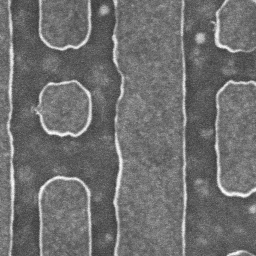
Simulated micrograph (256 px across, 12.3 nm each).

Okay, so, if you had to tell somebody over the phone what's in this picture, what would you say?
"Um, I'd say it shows one or a few lines or trenches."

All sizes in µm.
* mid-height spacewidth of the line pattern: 0.376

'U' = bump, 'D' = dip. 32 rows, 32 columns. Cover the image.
UDDDDUUUUUUDDDUUUUUUUUUDDDDDUUUU
UDDDDUUUUUUDDDUUUUUUUUUDDDDUUUUU
UDDDDUUUUUUDDDUUUUUUUUUDDDDUUUUU
UDDDDUUUUUUDDDUUUUUUUUUDDDDUUUUU
UDDDDUUUUUUDDDUUUUUUUUUDDDDUUUUU
UUDDDDUUUUDDDDUUUUUUUUUDDDDUUUUU
UDDDDDDDDDDDDDUUUUUUUUUDDDDDDDDD
UUDDDDDDDDDDDDUUUUUUUUUDDDDDDDDD
UUDDDDDDDDDDDDDUUUUUUUUDDDDDDDDD
UDDDDDDDDDDDDDDUUUUUUUUDDDDDDDDD
UDDDDDDUUUDDDDDUUUUUUUUDDDDDUUUU
UDDDDUUUUUUDDDDUUUUUUUUDDDDUUUUU
UDDDDUUUUUUDDDDUUUUUUUUDDDDUUUUU
UDDDDUUUUUUDDDDUUUUUUUUDDDDUUUUU
UDDDDUUUUUUDDDDUUUUUUUUDDDDUUUUU
UDDDDUUUUUUDDDUUUUUUUUUDDDDUUUUU
UDDDDDUUUUDDDDUUUUUUUUUDDDDUUUUU
UDDDDDDDDDDDDDDUUUUUUUUDDDDUUUUU
UUDDDDDDDDDDDDDUUUUUUUUDDDDUUUUU
UDDDDDDDDDDDDDDUUUUUUUUDDDDUUUUU
UDDDDDDDDDDDDDDUUUUUUUUDDDDUUUUU
UDDDDDDDDDDDDDDUUUUUUUUDDDDUUUUU
UDDDDDUUUUDDDDDUUUUUUUUDDDDUUUUU
UUDDDUUUUUUDDDDUUUUUUUUDDDDDUUUU
UUDDDUUUUUUDDDUUUUUUUUUDDDDDDDDD
UDDDDUUUUUUDDDUUUUUUUUUDDDDDDDDD
UUDDDUUUUUUDDDDUUUUUUUUDDDDDDDDD
UDDDDUUUUUUDDDDUUUUUUUUDDDDDDDDD
UDDDDUUUUUUDDDDUUUUUUUUDDDDDDDDD
UDDDDUUUUUUDDDDUUUUUUUUDDDDDDDDD
UDDDDUUUUUUDDDDUUUUUUUUDDDDDDDDD
UDDDDUUUUUUDDDUUUUUUUUUDDDDDDDUD